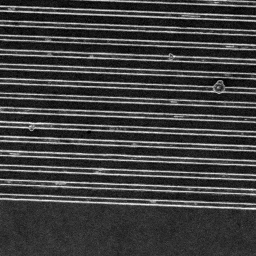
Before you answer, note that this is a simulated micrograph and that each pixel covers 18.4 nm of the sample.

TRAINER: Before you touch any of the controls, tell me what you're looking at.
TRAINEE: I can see parallel lines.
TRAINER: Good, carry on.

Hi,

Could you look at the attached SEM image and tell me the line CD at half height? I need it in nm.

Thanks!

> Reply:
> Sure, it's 94.3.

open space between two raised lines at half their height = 0.172 um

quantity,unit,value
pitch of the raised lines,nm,266